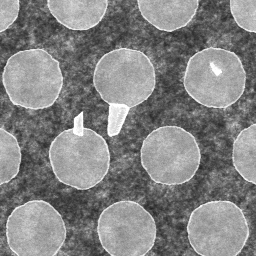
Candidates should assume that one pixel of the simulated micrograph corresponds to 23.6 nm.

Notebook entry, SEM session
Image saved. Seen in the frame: raised bodies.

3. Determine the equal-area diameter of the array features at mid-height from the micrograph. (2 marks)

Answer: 60.7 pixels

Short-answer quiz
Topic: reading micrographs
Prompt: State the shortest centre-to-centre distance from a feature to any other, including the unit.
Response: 2030 nm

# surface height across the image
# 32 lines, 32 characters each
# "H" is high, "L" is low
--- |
HHLLLLHHHHHHHLLLLHHHHHHHHLLLLHHH
HHLLLLHHHHHHHLLLLLHHHHHHLLLLLHHH
HHLLLLLHHHHHLLLLLLHHHHHHLLLLLHHH
HLLLLLLLLHLLLLLLLLLLHHLLLLLLLLHH
LLLLLLLLLLLLLLLLLLLLLLLLLLLLLLLL
LLLLLLLLLLLLLLLLLLLLLLLLLLLLLLLL
LLLHHHLLLLLLLLHHLLLLLLLLLHHHHLLL
LHHHHHHLLLLLLHHHLHHLLLLLHHHHHHLL
LHHHHHHLLLLLHHHHHHHLLLLHHHHHHHLL
HHHHHHHHLLLLHHHHHHHLLLLHHHHHHHHL
HHHHHHHHLLLLHHHHHHHLLLLHHHHHHHHL
LHHHHHHLLLLLHHHHHHHLLLLHHHHHHHLL
LHHHHHHLLLLLLHHHHHLLLLLLHHHHHHLL
LLLHHLLLLLLLLLHHLLLLLLLLLLLLLLLL
LLLLLLLLLLLLLLHHLLLLLLLLLLLLLLLL
LLLLLLLLLHLLLLHLLLLLLLLLLLLLLLLL
HLLLLLLLHHHHLLHLLLLHHHHLLLLLLLHH
HHLLLLLHHHHHHLLLLLHHHHHHLLLLLLHH
HHLLLLHHHHHHHLLLLLHHHHHHHLLLLHHH
HHHLLLHHHHHHHHLLLLHHHHHHHLLLLHHH
HHLLLLHHHHHHHHLLLLHHHHHHHLLLLHHH
HHLLLLLHHHHHHLLLLLHHHHHHLLLLLLHH
HLLLLLLLHHHHHLLLLLLHHHHLLLLLLLLH
LLLLLLLLLLHLLLLLLLLLLLLLLLLLLLLL
LLLLLLLLLLLLLLLLLLLLLLLLLLLLLLLL
LLLHHHLLLLLLLLHHHLLLLLLLLLHHHLLL
LLHHHHHLLLLLLHHHHHLLLLLLHHHHHHLL
LHHHHHHHLLLLHHHHHHHLLLLLHHHHHHHL
LHHHHHHHLLLLHHHHHHHLLLLHHHHHHHHL
LHHHHHHHLLLLHHHHHHHLLLLLHHHHHHHL
LHHHHHHHLLLLLHHHHHHLLLLLHHHHHHHL
LLHHHHHLLLLLLHHHHHLLLLLLLHHHHHLL